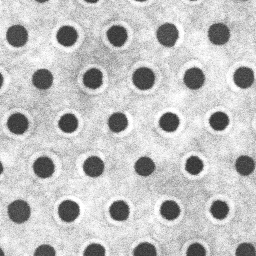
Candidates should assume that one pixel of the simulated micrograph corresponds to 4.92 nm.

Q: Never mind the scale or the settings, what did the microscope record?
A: a regular array of holes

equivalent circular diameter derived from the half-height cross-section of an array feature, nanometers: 105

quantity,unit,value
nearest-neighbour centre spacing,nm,244